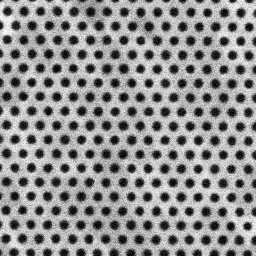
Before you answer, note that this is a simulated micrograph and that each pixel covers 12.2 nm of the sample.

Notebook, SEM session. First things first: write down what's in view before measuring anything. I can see a regular array of holes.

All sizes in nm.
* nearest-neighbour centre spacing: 196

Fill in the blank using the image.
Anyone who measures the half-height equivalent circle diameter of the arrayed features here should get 123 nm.